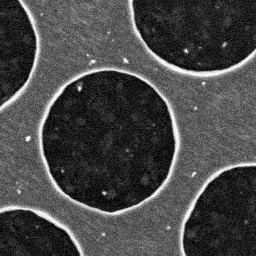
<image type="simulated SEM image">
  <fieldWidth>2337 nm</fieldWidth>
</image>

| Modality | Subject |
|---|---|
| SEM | holes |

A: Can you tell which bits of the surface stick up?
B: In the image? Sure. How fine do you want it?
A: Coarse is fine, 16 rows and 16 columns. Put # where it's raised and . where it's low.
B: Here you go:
..######........
..######........
..#######.......
..########......
..####..####.###
.###......######
###.......######
###........#####
###........#####
###........#####
###........###..
###.......###...
#####....###....
...#########....
....#######.....
.....######.....